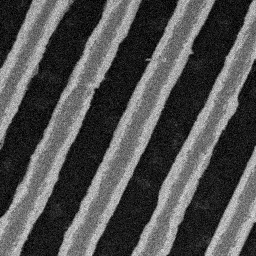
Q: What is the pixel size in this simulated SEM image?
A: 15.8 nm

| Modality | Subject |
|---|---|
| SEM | one or a few lines or trenches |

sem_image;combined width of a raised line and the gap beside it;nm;1040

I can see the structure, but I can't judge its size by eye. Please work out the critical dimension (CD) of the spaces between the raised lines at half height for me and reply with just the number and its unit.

0.695 micrometres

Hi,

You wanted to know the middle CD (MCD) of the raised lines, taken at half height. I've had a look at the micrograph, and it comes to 339 nm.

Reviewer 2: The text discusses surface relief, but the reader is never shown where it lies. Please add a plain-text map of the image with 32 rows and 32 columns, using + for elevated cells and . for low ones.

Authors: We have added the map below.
.....+++......++.......+++......
....+++.......++......++++......
....+++......+++......+++......+
...+++......+++......++++......+
...+++......+++......+++......++
..+++......+++......+++.......++
..+++......+++......+++......+++
.+++......+++......+++.......+++
.+++......+++......+++.......++.
+++.......+++......+++......+++.
+++......+++......+++......+++..
++.......+++.....++++......+++..
++......+++......+++.......++...
++.....++++......+++......+++...
+......+++......+++.......+++...
+......+++......+++......+++....
......+++......+++......+++.....
......+++......+++......+++.....
.....+++......+++......+++......
.....+++......+++......+++......
....+++......++++.....+++.......
....+++......+++......+++......+
....++......+++......+++.......+
...+++......+++......+++......++
...+++.....++++......++.......++
..+++......+++......+++......+++
.+++......+++.......++.......+++
.+++......+++......+++......+++.
+++......++++......++.......+++.
+++......+++......+++......+++..
++......+++.......+++......+++..
++......+++......+++......+++...